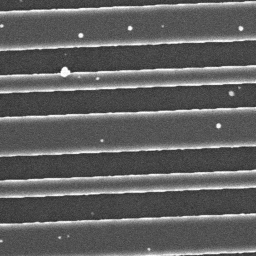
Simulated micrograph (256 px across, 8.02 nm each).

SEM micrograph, lines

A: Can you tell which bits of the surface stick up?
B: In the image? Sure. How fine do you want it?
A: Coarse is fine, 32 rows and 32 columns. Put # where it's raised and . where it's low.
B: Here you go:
........................########
################################
################################
################################
################################
##################..............
................................
................................
.........................#######
################################
############################....
#...............................
................................
.............................###
......##########################
################################
################################
################################
##########################......
................................
................................
...........................#####
...#############################
############################....
#####...........................
................................
................................
.............###################
################################
################################
################################
###############################.